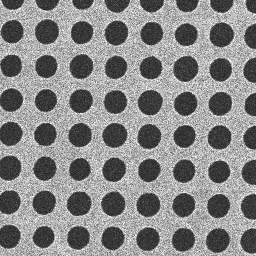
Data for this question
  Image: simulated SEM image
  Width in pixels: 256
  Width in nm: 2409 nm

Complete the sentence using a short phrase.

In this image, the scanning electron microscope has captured a regular array of holes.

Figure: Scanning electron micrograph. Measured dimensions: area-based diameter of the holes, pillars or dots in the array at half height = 223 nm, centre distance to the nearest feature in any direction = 320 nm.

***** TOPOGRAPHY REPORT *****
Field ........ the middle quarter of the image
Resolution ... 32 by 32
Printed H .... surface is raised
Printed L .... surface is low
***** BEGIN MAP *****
HLLLLLLHHHLLLLLLHHHLLLLLLHHLLLLL
HLLLLLLHHHLLLLLLHHHLLLLLLHHLLLLL
HHLLLLLHHHLLLLLHHHHLLLLLHHHLLLLL
HHHLLHHHHHHLLLHHHHHHLLLHHHHHLLLL
HHHHHHHHHHHHHHHHHHHHHHHHHHHHHHHH
HHHHHHHHHHHHHHHHHHHHHHHHHHHHHHHH
HHHHLHHHHHHHLHHHHHHHHLHHHHHHHHHH
HHLLLLLHHHHLLLLHHHHLLLLLHHHHHLLL
HLLLLLLHHHLLLLLLHHHLLLLLLHHHLLLL
HLLLLLLHHHLLLLLLHHLLLLLLLHHHLLLL
HHLLLLLHHHLLLLLLHHHLLLLLHHHLLLLL
HHLLLLHHHHHLLLLHHHHLLLLLHHHHLLLL
HHHHHHHHHHHHLHHHHHHHLLLHHHHHHLLL
HHHHHHHHHHHHHHHHHHHHHHHHHHHHHHHH
HHHHHHHHHHHHHHHHHHHHHHHHHHHHHHHH
HHLLLLHHHHHLLLLHHHHHLLLHHHHHHLLH
HLLLLLLHHHLLLLLLHHHLLLLLHHHHLLLL
HLLLLLLHHHLLLLLLHHLLLLLLHHHLLLLL
HLLLLLLHHHLLLLLLHHLLLLLLHHHLLLLL
HLLLLLHHHHLLLLLHHHHLLLLLHHHHLLLL
HHHLLHHHHHHLLLHHHHHLLLLHHHHHHLLH
HHHHHHHHHHHHHHHHHHHHHHHHHHHHHHHH
HHHHHHHHHHHHHHHHHHHHHHHHHHHHHHHH
HHHHHHHHHHHHLLHHHHHHHHHHHHHHHHHH
HHLLLLHHHHLLLLLHHHHLLLLHHHHHLLLL
HLLLLLLHHHLLLLLHHHHLLLLLHHHHLLLL
HLLLLLLHHHLLLLLLHHLLLLLLHHHLLLLL
HLLLLLHHHHLLLLLHHHLLLLLLHHHLLLLL
HHLLLLHHHHLLLLLHHHHLLLLHHHHLLLLL
HHHHHHHHHHHHLHHHHHHHHLHHHHHHHLLH
HHHHHHHHHHHHHHHHHHHHHHHHHHHHHHHH
HHHHHHHHHHHHHHHHHHHHHHHHHHHHHHHH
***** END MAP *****